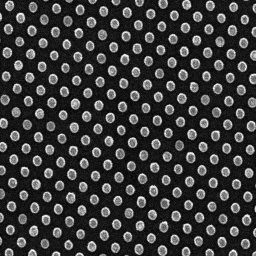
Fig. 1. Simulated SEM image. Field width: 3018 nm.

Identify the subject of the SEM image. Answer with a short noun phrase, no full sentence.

a regular array of raised bodies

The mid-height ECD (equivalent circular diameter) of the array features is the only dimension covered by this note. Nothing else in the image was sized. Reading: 110 nanometres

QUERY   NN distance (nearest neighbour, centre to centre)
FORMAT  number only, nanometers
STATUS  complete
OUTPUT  194